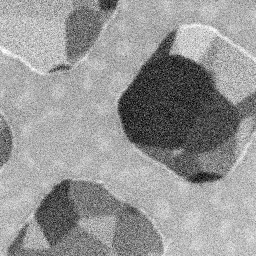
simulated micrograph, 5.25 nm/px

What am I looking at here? raised bodies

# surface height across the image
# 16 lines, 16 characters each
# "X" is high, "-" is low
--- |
XXXXXXX---------
XXXXXXX---------
XXXXXX----XXXX--
-XXXX----XXXXXXX
--XX-----XXXXXXX
--------XXXXXXXX
-------XXXXXXXXX
-------XXXXXXXXX
X-------XXXXXXXX
X--------XXXXXX-
----------XXXXX-
----XX------X---
---XXXXX--------
--XXXXXXX-------
-XXXXXXXXX------
XXXXXXXXXX------